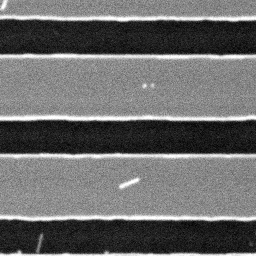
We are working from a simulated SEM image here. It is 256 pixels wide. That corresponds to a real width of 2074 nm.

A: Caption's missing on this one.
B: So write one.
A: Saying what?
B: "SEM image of lines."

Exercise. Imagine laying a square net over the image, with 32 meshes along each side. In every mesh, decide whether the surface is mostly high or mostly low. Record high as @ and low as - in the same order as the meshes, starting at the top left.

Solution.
@@@@@@@@@@@@@@@@@@@@@@@@@@@@@@@@
@@@@@@@@@@@@@@@@@@@@@@@@@@@@@@@@
--------------@@------------@@--
--------------------------------
--------------------------------
--------------------------------
--------------------------------
@@@@@@@@@@@@@@@@@@@@@@@@@@@@@@@@
@@@@@@@@@@@@@@@@@@@@@@@@@@@@@@@@
@@@@@@@@@@@@@@@@@@@@@@@@@@@@@@@@
@@@@@@@@@@@@@@@@@@@@@@@@@@@@@@@@
@@@@@@@@@@@@@@@@@@@@@@@@@@@@@@@@
@@@@@@@@@@@@@@@@@@@@@@@@@@@@@@@@
@@@@@@@@@@@@@@@@@@@@@@@@@@@@@@@@
@@@@@@@@@@@@@@@@@@@@@@@@@@@@@@@@
--------------------------------
--------------------------------
--------------------------------
--------------------------------
@@@@@@@@@@@@@@@@@@@@@@@@@@@@@@@@
@@@@@@@@@@@@@@@@@@@@@@@@@@@@@@@@
@@@@@@@@@@@@@@@@@@@@@@@@@@@@@@@@
@@@@@@@@@@@@@@@@@@@@@@@@@@@@@@@@
@@@@@@@@@@@@@@@@@@@@@@@@@@@@@@@@
@@@@@@@@@@@@@@@@@@@@@@@@@@@@@@@@
@@@@@@@@@@@@@@@@@@@@@@@@@@@@@@@@
@@@@@@@@@@@@@@@@@@@@@@@@@@@@@@@@
--------------------------------
--------------------------------
--------------------------------
--------------------------------
--------------------------------